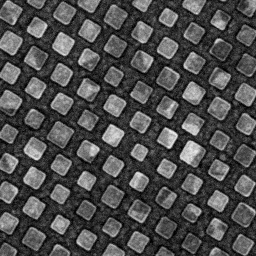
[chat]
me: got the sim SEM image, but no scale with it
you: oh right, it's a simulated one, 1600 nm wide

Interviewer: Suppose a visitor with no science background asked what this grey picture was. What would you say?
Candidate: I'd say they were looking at a regular array of raised bodies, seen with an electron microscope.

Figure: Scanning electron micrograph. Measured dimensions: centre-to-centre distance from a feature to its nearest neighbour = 0.183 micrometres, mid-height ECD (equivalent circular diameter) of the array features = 118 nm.